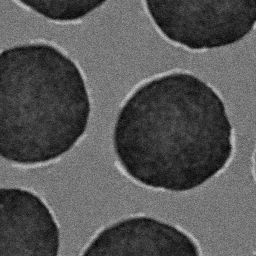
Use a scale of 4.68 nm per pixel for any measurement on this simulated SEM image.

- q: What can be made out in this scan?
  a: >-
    holes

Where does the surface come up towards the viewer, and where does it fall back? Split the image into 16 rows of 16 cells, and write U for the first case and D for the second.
UUDDDDUUUDDDDDDD
UUUUUUUUUUDDDDDD
UUUUUUUUUUUDDDDU
DDDDUUUUUUUUUUUU
DDDDDUUUUUUUUUUU
DDDDDUUUUDDDDUUU
DDDDDDUUDDDDDDUU
DDDDDUUDDDDDDDUU
DDDDDUUDDDDDDDUU
DDDDUUUDDDDDDDUU
UUUUUUUUDDDDDDUU
UUUUUUUUUDDDUUUU
DDUUUUUUUUUUUUUU
DDDUUUUUUUUUUUUU
DDDDUUDDDDDUUUUU
DDDDUDDDDDDDUUUU